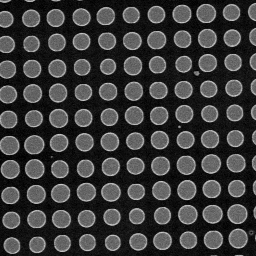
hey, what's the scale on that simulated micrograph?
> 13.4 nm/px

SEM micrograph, an array of small figures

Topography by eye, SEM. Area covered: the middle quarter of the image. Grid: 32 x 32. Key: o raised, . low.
...ooo...oooo..oooo..oooo...oooo
...ooo...oooo..oooo...ooo...ooo.
...ooo....oo....ooo.............
................................
.............................oo.
...ooo...oooo...ooo...oooo..oooo
o..oooo..oooo..ooooo.ooooo..oooo
o..oooo..oooo..ooooo..oooo..oooo
...ooo....ooo...ooo....oo....oo.
................................
.............................oo.
....oo....ooo...ooo...oooo..oooo
o..oooo..oooo..ooooo..oooo..oooo
o..oooo..oooo..ooooo..oooo..oooo
o..oooo...ooo...ooo...ooo....oo.
....oo..........................
................................
....oo....ooo...ooo...oooo...ooo
o..oooo..oooo...oooo..oooo..oooo
o..oooo..ooooo..oooo..oooo..oooo
o..oooo..oooo...oooo..oooo...ooo
....oo....oo....................
................................
...........o.....o.....oo....ooo
....ooo...oooo..oooo..oooo..oooo
o..oooo...oooo..oooo..oooo..oooo
o..oooo...oooo..oooo..oooo...ooo
o...ooo...ooo....o.....oo.....oo
................................
.......................oo.....oo
o...ooo...ooo....ooo..oooo...ooo
o..ooooo.ooooo..oooo..oooo..oooo